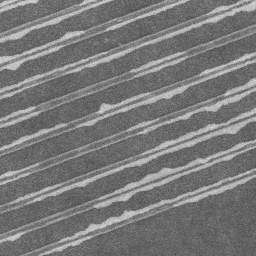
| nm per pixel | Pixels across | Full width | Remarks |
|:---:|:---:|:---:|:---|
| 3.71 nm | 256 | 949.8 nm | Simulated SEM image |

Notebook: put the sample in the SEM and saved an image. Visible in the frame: parallel lines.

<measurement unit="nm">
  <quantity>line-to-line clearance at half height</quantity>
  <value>65.6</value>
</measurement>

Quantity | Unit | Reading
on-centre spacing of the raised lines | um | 0.0995